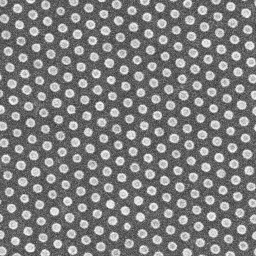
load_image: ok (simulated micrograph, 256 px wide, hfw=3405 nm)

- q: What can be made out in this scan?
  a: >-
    a regular array of raised bodies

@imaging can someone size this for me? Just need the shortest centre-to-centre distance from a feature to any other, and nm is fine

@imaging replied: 214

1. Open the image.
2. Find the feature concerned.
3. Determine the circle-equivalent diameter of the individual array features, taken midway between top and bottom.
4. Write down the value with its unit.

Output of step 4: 0.104 microns